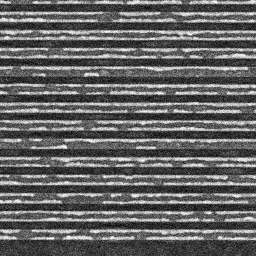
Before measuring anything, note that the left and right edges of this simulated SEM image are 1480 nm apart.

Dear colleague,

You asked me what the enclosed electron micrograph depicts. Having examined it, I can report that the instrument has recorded parallel lines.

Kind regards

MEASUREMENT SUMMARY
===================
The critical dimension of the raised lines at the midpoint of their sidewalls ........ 10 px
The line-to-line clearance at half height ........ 48.4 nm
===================